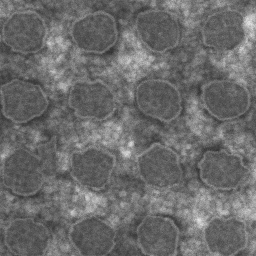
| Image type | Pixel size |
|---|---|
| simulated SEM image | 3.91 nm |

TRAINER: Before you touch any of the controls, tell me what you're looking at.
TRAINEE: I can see a regular array of raised bodies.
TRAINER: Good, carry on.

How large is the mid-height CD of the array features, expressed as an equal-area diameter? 0.169 µm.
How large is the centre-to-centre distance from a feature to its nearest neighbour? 0.247 micrometres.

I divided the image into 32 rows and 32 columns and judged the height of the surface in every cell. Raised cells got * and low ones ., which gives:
................................
...*..............***.......**..
.****.....****...*****....****..
******...*****...*****...*****..
******...******..*****...******.
.****.....****....****....****..
...*........*......*............
................................
................................
................................
.***.....****.....***.....****..
*****....*****...*****...******.
******...*****...******..******.
******...*****....*****...*****.
.****.....****.....***.....***..
................................
................................
................................
.....**....*.......**...........
.******..*****...*****....****..
*******..*****...*****...*****..
*******..*****...******..******.
******....****....*****..*****..
.****......**..............***..
................................
................................
................................
..**......***.....***.....****..
.*****...*****...*****....*****.
.*****...*****...*****....*****.
.*****...*****...*****....*****.
..****....****....****....****..